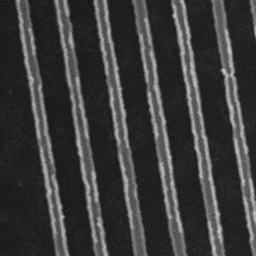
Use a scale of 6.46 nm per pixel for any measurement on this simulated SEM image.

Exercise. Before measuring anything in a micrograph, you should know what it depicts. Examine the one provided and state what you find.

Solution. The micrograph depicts parallel lines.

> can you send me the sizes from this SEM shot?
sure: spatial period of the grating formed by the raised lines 0.25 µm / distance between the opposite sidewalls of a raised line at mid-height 75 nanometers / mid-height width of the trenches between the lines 174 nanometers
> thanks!